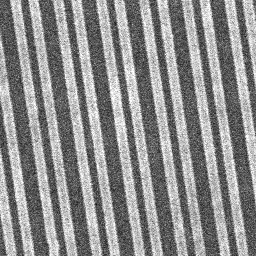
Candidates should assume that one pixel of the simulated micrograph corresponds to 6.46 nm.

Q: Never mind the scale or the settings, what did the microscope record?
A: parallel lines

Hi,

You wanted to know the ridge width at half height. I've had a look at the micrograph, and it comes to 58.3 nm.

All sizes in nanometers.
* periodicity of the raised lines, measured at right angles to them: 136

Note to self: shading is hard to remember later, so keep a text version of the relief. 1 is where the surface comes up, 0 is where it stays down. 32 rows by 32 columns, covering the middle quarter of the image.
11001110000110011000011000110000
11000110000110011000001100110000
11000110000110011100001100110000
11100110000110001100001100111000
01100110000110001100001100011000
01100110000111001100001100011000
01100110000011001100001100011000
01100111000011001100000110011000
01100011000011001110000110011000
01110011000011000110000110011000
00110011000011000110000110011100
00110011000011100110000110001100
00110011000001100110000110001100
00110001100001100110000110001100
00110001100001100110000011001100
00110001100001100111000011001100
00111001100001100011000011001100
00011001100001100011000011001110
00011001100001110011000011000110
00011001100000110011000011000110
00011000110000110011000001100110
00011000110000110011100001100110
00011000110000110001100001100110
00011100110000110001100001100111
00001100110000111001100001100011
00001100110000011001100001100011
00001100011000011001100001100011
00001100011000011001100000110011
00001100011000011001110000110011
00001110011000011000110000110011
10000110011000011000110000110011
10000110011000011100110000110001